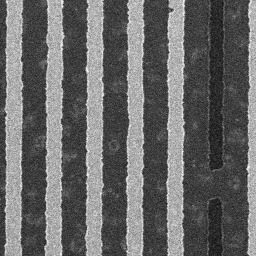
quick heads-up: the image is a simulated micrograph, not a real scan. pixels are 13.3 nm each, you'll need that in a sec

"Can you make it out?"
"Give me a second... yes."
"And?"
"parallel lines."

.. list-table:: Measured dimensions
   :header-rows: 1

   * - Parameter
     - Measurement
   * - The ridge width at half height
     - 0.199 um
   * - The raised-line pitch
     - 538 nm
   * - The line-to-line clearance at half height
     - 0.339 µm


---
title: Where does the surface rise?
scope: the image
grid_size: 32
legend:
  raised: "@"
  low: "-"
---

-@@---@@---@@---@@---@@---@@---@
-@@---@@---@@---@@---@@---@@---@
-@@---@@---@@---@@---@@---@@---@
-@@---@@---@@---@@---@@---@@---@
-@@---@@---@@---@@---@@---@@---@
-@@---@@---@@---@@---@@---@@---@
-@@---@@---@@---@@---@@---@@---@
-@@---@@---@@---@@---@@---@@---@
-@@---@@---@@---@@---@@---@@---@
-@@---@@---@@---@@---@@---@@---@
-@@---@@---@@---@@---@@---@@---@
-@@---@@---@@---@@---@@---@@---@
-@@---@@---@@---@@---@@---@@---@
-@@---@@---@@---@@---@@---@@---@
-@@---@@---@@---@@---@@---@@---@
-@@---@@---@@---@@---@@---@@---@
-@@---@@---@@---@@---@@---@@---@
-@@---@@---@@---@@---@@---@@---@
-@@---@@---@@-@-@@---@@---@@---@
-@@---@@---@@---@@---@@---@@---@
-@@---@@---@@---@@---@@---@@---@
-@@---@@---@@---@@---@@--------@
-@@---@@---@@---@@---@@--------@
-@@---@@---@@---@@---@@--------@
-@@---@@---@@---@@---@@--------@
-@@---@@---@@---@@---@@---@@---@
-@@---@@---@@---@@---@@---@@---@
-@@---@@---@@---@@---@@---@@---@
-@@---@@---@@---@@---@@---@@---@
-@@---@@---@@---@@---@@---@@---@
-@@---@@---@@---@@---@@---@@---@
-@@---@@---@@---@@---@@---@@---@